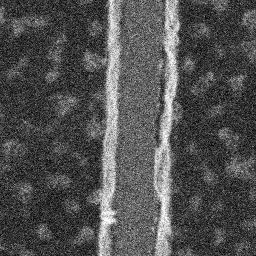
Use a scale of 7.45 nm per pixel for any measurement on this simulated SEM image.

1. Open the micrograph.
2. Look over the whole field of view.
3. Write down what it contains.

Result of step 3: one or a few lines or trenches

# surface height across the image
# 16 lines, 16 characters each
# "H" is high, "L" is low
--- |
HHHHHHHLLLLHHHHH
HHHHHHHLLLLHHHHH
HHHHHHHLLLLHHHHH
HHHHHHHLLLLHHHHH
HHHHHHHLLLLHHHHH
HHHHHHHLLLLHHHHH
HHHHHHHLLLLHHHHH
HHHHHHHLLLHHHHHH
HHHHHHHLLLHHHHHH
HHHHHHHLLLHHHHHH
HHHHHHHLLLHHHHHH
HHHHHHHLLLHHHHHH
HHHHHHHLLLHHHHHH
HHHHHHHLLLHHHHHH
HHHHHHHLLLHHHHHH
HHHHHHHLLLHHHHHH